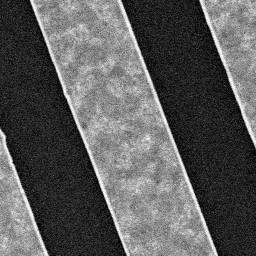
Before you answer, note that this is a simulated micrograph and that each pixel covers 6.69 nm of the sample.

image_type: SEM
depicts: one or a few lines or trenches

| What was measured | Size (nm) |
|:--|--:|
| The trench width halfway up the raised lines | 504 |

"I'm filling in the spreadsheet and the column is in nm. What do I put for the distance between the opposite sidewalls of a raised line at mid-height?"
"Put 554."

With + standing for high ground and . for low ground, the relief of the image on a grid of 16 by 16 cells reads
..++++++.....+++
..++++++.....+++
...+++++.....+++
...++++++.....++
....+++++.....++
....++++++.....+
....++++++.....+
.....+++++.....+
.....++++++.....
......+++++.....
+.....+++++.....
+.....++++++....
++.....+++++....
++.....++++++...
++.....++++++...
+++.....+++++...